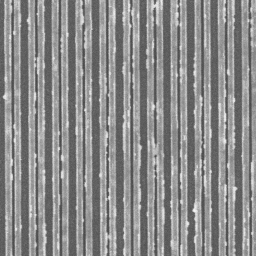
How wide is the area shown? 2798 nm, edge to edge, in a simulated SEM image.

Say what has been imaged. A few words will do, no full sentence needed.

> parallel lines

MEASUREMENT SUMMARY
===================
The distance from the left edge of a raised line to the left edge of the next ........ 130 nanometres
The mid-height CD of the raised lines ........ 75.2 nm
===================